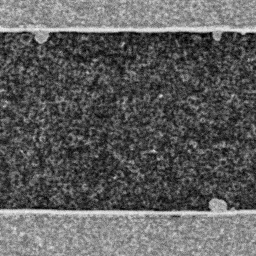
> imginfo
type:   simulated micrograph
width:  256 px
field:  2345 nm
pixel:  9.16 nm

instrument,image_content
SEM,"one or a few lines or trenches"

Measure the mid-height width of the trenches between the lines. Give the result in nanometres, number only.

1680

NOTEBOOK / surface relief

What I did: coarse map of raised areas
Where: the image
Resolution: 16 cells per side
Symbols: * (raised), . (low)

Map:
****************
****************
................
................
................
................
................
................
................
................
................
................
................
****************
****************
****************